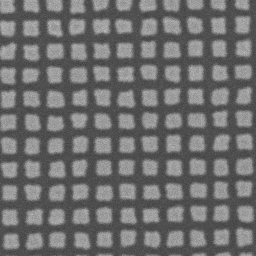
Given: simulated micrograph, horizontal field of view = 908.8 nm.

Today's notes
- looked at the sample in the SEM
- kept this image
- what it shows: a regular array of raised bodies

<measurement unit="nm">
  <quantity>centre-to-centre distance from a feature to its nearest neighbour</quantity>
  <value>80.3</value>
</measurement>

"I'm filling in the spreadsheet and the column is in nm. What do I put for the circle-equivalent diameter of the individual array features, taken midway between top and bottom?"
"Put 59.4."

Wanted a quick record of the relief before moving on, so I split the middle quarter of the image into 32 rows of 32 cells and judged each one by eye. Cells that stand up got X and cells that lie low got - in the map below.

--------------------XXX--------X
--XXXX-XXXX--XXXX--XXXX--XXXX--X
--XXXX--XXX--XXXX--XXXX--XXXX--X
--XXXX--XXX--XXXX---XXX--XXXX--X
--XXXX--------------------------
--------------------------------
----X---XXX---------XXX---XXX--X
--XXXX--XXXX--XXX---XXX--XXXX--X
--XXXX--XXXX--XXX---XXX--XXXX--X
--XXXX--XXXX-XXXXX--XXX--XXXX--X
--------------XXX---------------
--------------------------------
--XX----X-----X-----XXX----XX--X
--XXXX--XXX---XXX---XXX---XXX--X
--XXX---XXXX--XXX---XXX--XXXX--X
--XXX---XXXX--XXXX--XXX---XXX---
--------------------------------
--------------------------------
---XXX---XX---XX----XXXX--XXX---
--XXXX--XXXX--XXX---XXX---XXX--X
--XXXX--XXXX--XXX---XXX---XXX--X
--XXXX--XXXX--XXX---XXX---XXX---
--------------------------------
--------------------------------
--XXXX--XXXX--XXXX--XXX---XXX---
--XXXX--XXXX--XXX---XXX---XXX---
--XXX---XXXX--XXX---XXX---XXX---
--XXX----XXX--XXX---XXX---XXX---
--------------------------------
--------------------------------
--XXXX--------XXX---XXX--XXXX---
--XXXX---XXX--XXXX--XXXX--XXXX--